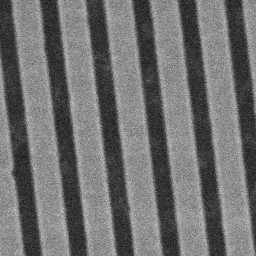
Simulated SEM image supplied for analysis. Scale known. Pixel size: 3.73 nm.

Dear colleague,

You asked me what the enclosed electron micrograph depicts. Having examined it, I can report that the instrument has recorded parallel lines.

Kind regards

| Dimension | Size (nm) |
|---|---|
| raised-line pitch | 171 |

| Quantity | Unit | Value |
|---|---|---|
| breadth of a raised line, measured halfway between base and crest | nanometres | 102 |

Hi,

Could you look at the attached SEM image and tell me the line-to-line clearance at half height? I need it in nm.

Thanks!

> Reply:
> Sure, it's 70.5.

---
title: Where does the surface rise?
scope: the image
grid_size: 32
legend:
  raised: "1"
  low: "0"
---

00111001111001111001110001110011
00111001111001111001110001110011
00111000111001111001111001110001
00111000111001111001111001110001
00111000111000111001111001111001
00111000111000111001111001111001
00111100111000111000111001111001
00111100111100111000111001111001
00011100111100111000111000111001
00011100111100111100111000111000
00011100111100111100111000111000
00011100011100111100111100111000
10011100011100011100111100111000
10011110011100011100111100111100
10011110011100011100011100111100
10011110011110011100011100111100
10011110011110011100011100011100
10001110011110011110011100011100
10001110011110011110011100011100
11001110001110011110011110011100
11001110001110001110011110011100
11001110001110001110011110011110
11001111001110001110001110011110
11001111001110001110001110011110
11001111001111001110001110011110
11000111001111001111001110001110
11000111001111001111001110001110
11000111000111001111001111001110
11100111000111001111001111001110
11100111000111000111001111001111
11100111100111000111001111001111
11100111100111000111000111001111